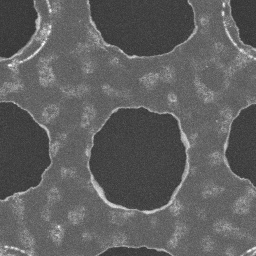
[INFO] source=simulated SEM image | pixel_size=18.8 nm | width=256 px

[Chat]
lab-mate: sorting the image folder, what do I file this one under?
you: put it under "holes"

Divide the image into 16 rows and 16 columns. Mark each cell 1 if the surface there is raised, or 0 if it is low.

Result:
0011110000001100
0011110000001110
0011111000001110
0111111100111111
1111111111111111
1111111111111111
0111111111111111
0011111000011110
0001110000011100
0001110000001100
0001110000001100
0011110000011111
1111111000011111
1111111111111111
1111111111111111
1111111001111111